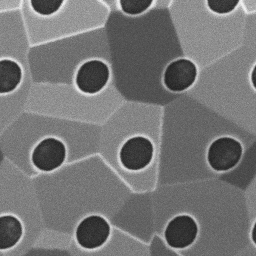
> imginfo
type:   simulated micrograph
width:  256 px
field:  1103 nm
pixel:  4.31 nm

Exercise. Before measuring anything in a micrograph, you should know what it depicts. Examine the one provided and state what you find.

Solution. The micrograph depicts holes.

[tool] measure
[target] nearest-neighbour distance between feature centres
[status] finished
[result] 378 nm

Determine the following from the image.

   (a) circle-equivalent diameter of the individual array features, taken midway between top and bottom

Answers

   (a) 145 nm